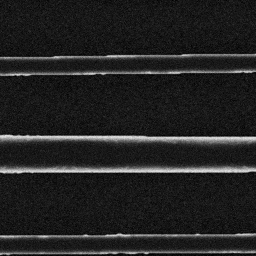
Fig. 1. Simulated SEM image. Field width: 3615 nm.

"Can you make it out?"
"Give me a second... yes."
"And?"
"lines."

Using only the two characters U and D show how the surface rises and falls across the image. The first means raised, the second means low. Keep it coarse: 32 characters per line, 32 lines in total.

DDDDDDDDDDDDDDDDDDDDDDDDDDDDDDDD
DDDDDDDDDDDDDDDDDDDDDDDDDDDDDDDD
DDDDDDDDDDDDDDDDDDDDDDDDDDDDDDDD
DDDDDDDDDDDDDDDDDDDDDDDDDDDDDDDD
DDDDDDDDDDDDDDDDDDDDDDDDDDDDDDDD
DDDDDDDDDDDDDDDDDDDDDDDDDDDDDDDD
DDDDDDDDDDDDDDDDDDDDDDDDDDDDDDDD
UUUUUUUUUUUUUUUUUUUUUUUUUUUUUUUU
UUUUUUUUUUUUUUUUUUUUUUUUUUUUUUUU
DDDDDDDDDDDDDDDDDDDDDDDDDDDDDDDD
DDDDDDDDDDDDDDDDDDDDDDDDDDDDDDDD
DDDDDDDDDDDDDDDDDDDDDDDDDDDDDDDD
DDDDDDDDDDDDDDDDDDDDDDDDDDDDDDDD
DDDDDDDDDDDDDDDDDDDDDDDDDDDDDDDD
DDDDDDDDDDDDDDDDDDDDDDDDDDDDDDDD
DDDDDDDDDDDDDDDDDDDDDDDDDDDDDDDD
DDDDDDDDDDDDDDDDDDDDDDDDDDDDDDDD
UUUUUUUUUUUUUUUUUUUUUUUUUUUUUUUU
UUUUUUUUUUUUUUUUUUUUUUUUUUUUUUUU
UUUUUUUUUUUUUUUUUUUUUUUUUUUUUUUU
UUUUUUUUUUUUUUUUUUUUUUUUUUUUUUUU
DDDDDDDDDDDDDDDDDDDDDDDDDDDDDDDD
DDDDDDDDDDDDDDDDDDDDDDDDDDDDDDDD
DDDDDDDDDDDDDDDDDDDDDDDDDDDDDDDD
DDDDDDDDDDDDDDDDDDDDDDDDDDDDDDDD
DDDDDDDDDDDDDDDDDDDDDDDDDDDDDDDD
DDDDDDDDDDDDDDDDDDDDDDDDDDDDDDDD
DDDDDDDDDDDDDDDDDDDDDDDDDDDDDDDD
DDDDDDDDDDDDDDDDDDDDDDDDDDDDDDDD
DDDDDDDDDDUDDUUUUUUUUUUUUUUUUUUU
UUUUUUUUUUUUUUUUUUUUUUUUUUUUUUUU
UUUUUUUUUUUUUUUUUUUUUUUUUUUUUUUU